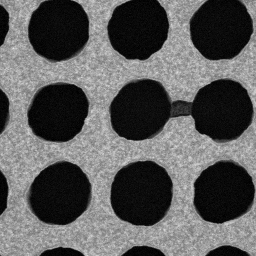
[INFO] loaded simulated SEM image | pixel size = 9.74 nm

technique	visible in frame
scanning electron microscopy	holes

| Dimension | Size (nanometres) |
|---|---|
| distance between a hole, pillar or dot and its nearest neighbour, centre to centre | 795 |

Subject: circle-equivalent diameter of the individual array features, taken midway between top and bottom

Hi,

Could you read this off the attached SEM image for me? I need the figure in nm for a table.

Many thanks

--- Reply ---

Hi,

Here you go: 606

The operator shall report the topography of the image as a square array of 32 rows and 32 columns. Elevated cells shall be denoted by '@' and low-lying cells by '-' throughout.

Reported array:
@@@@@-----@@@@@-----@@@@@-----@@
-@@@-------@@@-------@@@-------@
-@@@-------@@@-------@@@-------@
-@@@-------@@--------@@@--------
-@@@-------@@@-------@@@-------@
@@@@-------@@@------@@@@-------@
@@@@@-----@@@@@----@@@@@@-----@@
@@@@@@--@@@@@@@@@@@@@@@@@@--@@@@
@@@@@@@@@@@@@@@@@@@@@@@@@@@@@@@@
@@@@@@@@@@@@@@@@@@@@@@@@@@@@@@@@
@@@@@@@--@@@@@@@----@@@@@@----@@
@@@@@-----@@@@@------@@@@------@
-@@@-------@@@--------@@-------@
-@@@-------@@@------------------
-@@--------@@@---------@--------
-@@@------@@@@-------@@@-------@
@@@@------@@@@------@@@@@-----@@
@@@@@@---@@@@@@@--@@@@@@@@@--@@@
@@@@@@@@@@@@@@@@@@@@@@@@@@@@@@@@
@@@@@@@@@@@@@@@@@@@@@@@@@@@@@@@@
@@@@@@@--@@@@@@@----@@@@@@@---@@
@@@@@-----@@@@@------@@@@------@
-@@@-------@@@-------@@@@-------
-@@@-------@@@--------@@--------
-@@@-------@@@--------@@--------
-@@@-------@@@-------@@@--------
@@@@-------@@@-------@@@@------@
@@@@@----@@@@@@-----@@@@@@---@@@
@@@@@@@@@@@@@@@@@@@@@@@@@@@@@@@@
@@@@@@@@@@@@@@@@@@@@@@@@@@@@@@@@
@@@@@@@@@@@@@@@@@@@@@@@@@@@@@@@@
@@@@@-----@@@@@@----@@@@@@-----@